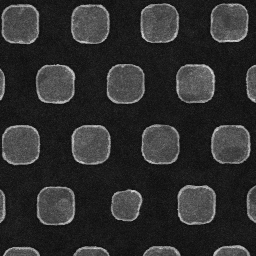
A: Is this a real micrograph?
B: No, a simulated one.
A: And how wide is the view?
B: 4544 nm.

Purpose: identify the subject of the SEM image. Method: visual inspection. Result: a regular array of raised bodies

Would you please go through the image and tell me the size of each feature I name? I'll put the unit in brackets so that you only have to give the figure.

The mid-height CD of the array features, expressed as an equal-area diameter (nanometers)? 716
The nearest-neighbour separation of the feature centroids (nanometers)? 1230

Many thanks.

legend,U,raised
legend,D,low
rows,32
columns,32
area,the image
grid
DDDDDDDDDDDDDDDDDDDDDDDDDDDDDDDD
DUUUUDDDDUUUUDDDDDUUUUDDDDDUUUUD
UUUUUDDDDUUUUDDDDDUUUUDDDDUUUUUD
UUUUUDDDDUUUUDDDDDUUUUDDDDUUUUUD
UUUUUDDDDUUUUDDDDDUUUUDDDDDUUUUD
DDDDDDDDDDDDDDDDDDDDDDDDDDDDDDDD
DDDDDDDDDDDDDDDDDDDDDDDDDDDDDDDD
DDDDDDDDDDDDDDDDDDDDDDDDDDDDDDDD
DDDDDUUUUDDDDDUUUUDDDDDUUUDDDDDU
DDDDDUUUUDDDDDUUUUDDDDUUUUUDDDDU
UDDDDUUUUDDDDUUUUUDDDDUUUUUDDDDU
DDDDDUUUUDDDDUUUUUDDDDUUUUUDDDDU
DDDDDUUUUDDDDDUUUDDDDDDUUUDDDDDD
DDDDDDDDDDDDDDDDDDDDDDDDDDDDDDDD
DDDDDDDDDDDDDDDDDDDDDDDDDDDDDDDD
DDDDDDDDDDDDDDDDDDDDDDDDDDDDDDDD
DUUUUDDDDUUUUDDDDDUUUUDDDDDUUUUD
UUUUUDDDDUUUUUDDDDUUUUDDDDDUUUUD
UUUUUDDDDUUUUUDDDDUUUUDDDDDUUUUD
UUUUUDDDDUUUUDDDDDUUUUDDDDDUUUUD
DDDDDDDDDDDDDDDDDDDDDDDDDDDDDDDD
DDDDDDDDDDDDDDDDDDDDDDDDDDDDDDDD
DDDDDDDDDDDDDDDDDDDDDDDDDDDDDDDD
DDDDDDUUDDDDDDDDDDDDDDDUUUDDDDDD
DDDDDUUUUDDDDDUUUUDDDDUUUUUDDDDU
UDDDDUUUUDDDDDUUUUDDDDUUUUUDDDDU
UDDDDUUUUDDDDDUUUDDDDDUUUUUDDDDU
DDDDDUUUUDDDDDDDDDDDDDDUUUDDDDDD
DDDDDDDDDDDDDDDDDDDDDDDDDDDDDDDD
DDDDDDDDDDDDDDDDDDDDDDDDDDDDDDDD
DDDDDDDDDDDDDDDDDDDDDDDDDDDDDDDD
DUUUUDDDDDUUUDDDDDUUUUDDDDDUUUUD